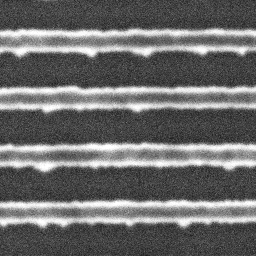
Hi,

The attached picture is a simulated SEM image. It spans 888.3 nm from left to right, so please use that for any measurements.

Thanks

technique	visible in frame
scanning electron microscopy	lines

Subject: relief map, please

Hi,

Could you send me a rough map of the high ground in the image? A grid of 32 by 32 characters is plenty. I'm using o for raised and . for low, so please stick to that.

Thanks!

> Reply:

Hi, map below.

................................
................................
................................
................................
oooooooooooooooooooooooooooooooo
oooooooooooooooooooooooooooooooo
................................
................................
................................
................................
................................
oooooooooooooooooooooooooooooooo
oooooooooooooooooooooooooooooooo
oooooooooooo.o.o................
................................
................................
................................
................................
oooooooooooooooooooooooooooooooo
oooooooooooooooooooooooooooooooo
oooooooooooooooooooooooo..oooooo
................................
................................
................................
................................
ooo.oooooooooooooooooooooooooooo
oooooooooooooooooooooooooooooooo
oooooooooooooooooooooooooooooooo
................................
................................
................................
................................